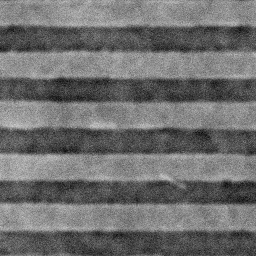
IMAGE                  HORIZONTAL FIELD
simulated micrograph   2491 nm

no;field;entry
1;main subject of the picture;lines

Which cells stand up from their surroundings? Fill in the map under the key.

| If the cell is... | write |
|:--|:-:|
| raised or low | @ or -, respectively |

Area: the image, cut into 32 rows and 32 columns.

@@@@@@@@@@@@@@@@@@@@@@@@@@@@@@@@
@@@@@@@@@@@@@@@@@@@@@@@@@@@@@@@@
@@@@@@@@@@@@@@@@@@@@@@@@@@@@@@@@
--------------------------------
--------------------------------
--------------------------------
--------------------------------
@@@@@@@@@@@@@@@@@@@@@@@@@@@@@@@@
@@@@@@@@@@@@@@@@@@@@@@@@@@@@@@@@
@@@@@@@@@@@@@@@@@@@@@@@@@@@@@@@@
--------------------------------
--------------------------------
--------------------------------
@@@@@@@@@@@@@@@@@@@@@@@@@@@@@@@@
@@@@@@@@@@@@@@@@@@@@@@@@@@@@@@@@
@@@@@@@@@@@@@@@@@@@@@@@@@@@@@@@@
--------------------------------
--------------------------------
--------------------------------
@@@@@@@@@@@@@@@@@@@@@@@@@@@@@@@-
@@@@@@@@@@@@@@@@@@@@@@@@@@@@@@@@
@@@@@@@@@@@@@@@@@@@@@@@@@@@@@@@@
---------------------@---@@@-@@@
--------------------------------
--------------------------------
--------------------------------
@@@@@@@@@@@@@@@@@@@@@@@@@@@@@@@@
@@@@@@@@@@@@@@@@@@@@@@@@@@@@@@@@
@@@@@@@@@@@@@@@@@@@@@@@@@@@@@@@@
--------------------------------
--------------------------------
--------------------------------